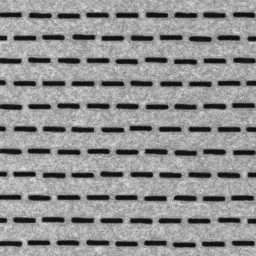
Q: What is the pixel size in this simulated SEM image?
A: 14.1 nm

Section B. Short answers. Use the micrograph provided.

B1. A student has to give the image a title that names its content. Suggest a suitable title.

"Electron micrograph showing a regular array of holes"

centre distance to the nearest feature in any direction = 370 nm